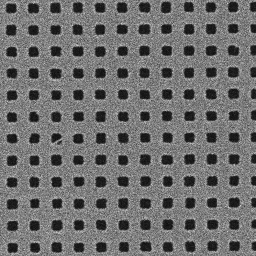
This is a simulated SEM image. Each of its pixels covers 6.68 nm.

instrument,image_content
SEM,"a regular array of holes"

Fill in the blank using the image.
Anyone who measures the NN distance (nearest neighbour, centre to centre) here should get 144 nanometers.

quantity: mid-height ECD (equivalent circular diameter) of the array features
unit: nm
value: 73.4